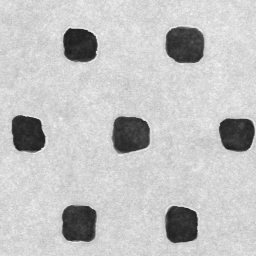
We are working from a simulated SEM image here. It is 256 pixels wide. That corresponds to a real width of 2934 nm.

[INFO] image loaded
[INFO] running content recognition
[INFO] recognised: holes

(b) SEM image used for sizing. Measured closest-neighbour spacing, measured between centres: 1170 nm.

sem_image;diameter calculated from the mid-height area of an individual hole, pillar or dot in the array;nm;410